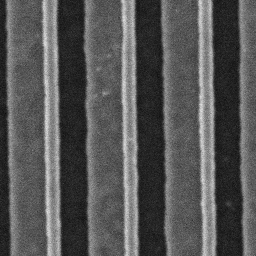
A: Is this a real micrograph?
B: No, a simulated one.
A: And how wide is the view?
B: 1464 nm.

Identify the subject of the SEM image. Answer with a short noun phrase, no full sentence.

lines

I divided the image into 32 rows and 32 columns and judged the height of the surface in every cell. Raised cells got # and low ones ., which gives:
.######....######...######....##
.######....######...######....##
.######....######...######....##
.######....######...######....##
.######....######...######....##
.######....######...######....##
.######....######....######...##
.######....######...#######...##
.######....######...#######...##
.######....######...#######...##
.######....######....######...##
.######....######....######...##
.######....######....######...##
.######....######....######...##
.######....######....######...##
.######....######....######...##
.######....######....######...##
.######....######....######...##
.######....######....######...##
.######....######....######...##
.######....######....######...##
.######....######....######...##
.######....######....######...##
.######....######....######...##
.######....######....######...##
.######....######....######...##
.######....######....######...##
.######....######....######...##
.######....######....######...##
.######....######....######...##
.######....######....######...##
.######....######....######...##